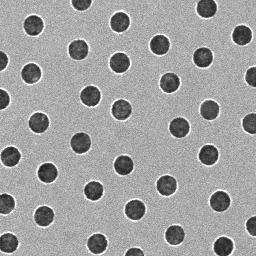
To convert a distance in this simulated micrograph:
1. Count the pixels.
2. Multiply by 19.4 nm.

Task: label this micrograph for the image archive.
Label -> a regular array of holes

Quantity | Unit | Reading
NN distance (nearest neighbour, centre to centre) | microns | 0.786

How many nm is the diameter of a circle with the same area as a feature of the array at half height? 398